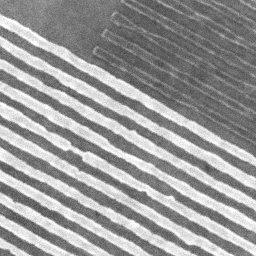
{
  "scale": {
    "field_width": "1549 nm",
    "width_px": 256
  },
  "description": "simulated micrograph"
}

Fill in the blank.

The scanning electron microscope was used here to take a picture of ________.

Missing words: parallel lines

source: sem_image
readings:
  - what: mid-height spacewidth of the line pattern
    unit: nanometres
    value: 66.8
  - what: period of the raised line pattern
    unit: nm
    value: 118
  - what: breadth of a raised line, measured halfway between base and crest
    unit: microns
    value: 0.0502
